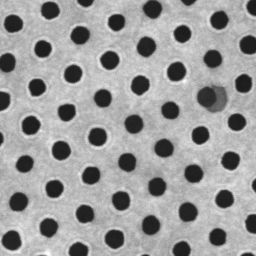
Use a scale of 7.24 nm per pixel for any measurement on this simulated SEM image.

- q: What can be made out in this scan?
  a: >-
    a regular array of holes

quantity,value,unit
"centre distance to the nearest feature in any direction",279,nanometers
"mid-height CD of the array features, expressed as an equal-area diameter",135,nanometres